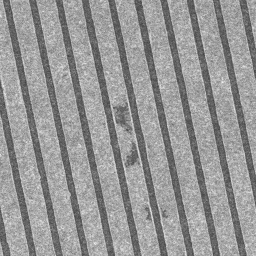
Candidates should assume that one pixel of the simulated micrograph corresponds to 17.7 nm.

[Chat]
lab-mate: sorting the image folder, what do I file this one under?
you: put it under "parallel lines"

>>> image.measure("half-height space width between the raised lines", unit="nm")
130